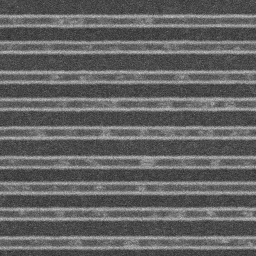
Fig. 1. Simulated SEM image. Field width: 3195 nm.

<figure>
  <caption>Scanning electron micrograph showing parallel lines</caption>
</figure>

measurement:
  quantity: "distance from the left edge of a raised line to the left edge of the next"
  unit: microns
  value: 0.346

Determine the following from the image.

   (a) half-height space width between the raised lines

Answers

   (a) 211 nanometres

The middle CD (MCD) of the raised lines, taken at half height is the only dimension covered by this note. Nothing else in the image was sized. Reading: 130 nm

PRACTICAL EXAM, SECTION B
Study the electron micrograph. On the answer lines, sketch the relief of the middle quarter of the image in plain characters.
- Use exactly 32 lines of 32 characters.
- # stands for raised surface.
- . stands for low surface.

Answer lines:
................................
................................
################################
################################
################################
................................
................................
................................
................................
################################
################################
................................
................................
................................
................................
................................
################################
################################
................................
................................
................................
................................
................................
################################
################################
################################
................................
................................
................................
................................
################################
################################